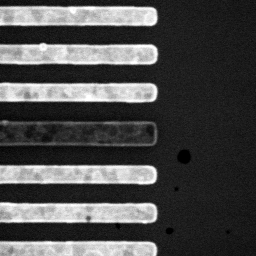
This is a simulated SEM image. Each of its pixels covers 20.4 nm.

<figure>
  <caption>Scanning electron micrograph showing wiring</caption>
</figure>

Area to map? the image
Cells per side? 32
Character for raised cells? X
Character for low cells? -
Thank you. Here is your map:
--------------------------------
XXXXXXXXXXXXXXXXXXX-------------
XXXXXXXXXXXXXXXXXXXX------------
--------------------------------
--------------------------------
--------------------------------
XXXXXXXXXXXXXXXXXXXX------------
XXXXXXXXXXXXXXXXXXX-------------
--------------------------------
--------------------------------
--------------------------------
XXXXXXXXXXXXXXXXXXXX------------
XXXXXXXXXXXXXXXXXXX-------------
--------------------------------
--------------------------------
XXXXXXXXXXXXXXXXXXX-------------
XXXXXXXXXXXXXXXXXXXX------------
XXXXXXXXXXXXXXXXXXXX------------
--------------------------------
--------------------------------
--------------------------------
XXXXXXXXXXXXXXXXXXX-------------
XXXXXXXXXXXXXXXXXXX-------------
--------------------------------
--------------------------------
XXXX-XXXXXXXXX-XXXX-------------
XXXXXXXXXXXXXXXXXXXX------------
XXXXXXXXXXXXXXXXXXX-------------
--------------------------------
--------------------------------
XXXXXXXXXXXXXXXXXXX-------------
XXXXXXXXXXXXXXXXXXX-------------